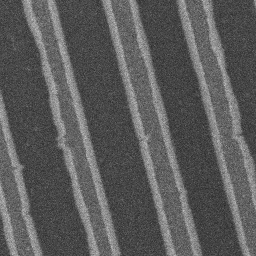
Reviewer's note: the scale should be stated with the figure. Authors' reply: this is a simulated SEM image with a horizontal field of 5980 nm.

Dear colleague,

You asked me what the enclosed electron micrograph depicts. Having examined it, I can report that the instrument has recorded one or a few lines or trenches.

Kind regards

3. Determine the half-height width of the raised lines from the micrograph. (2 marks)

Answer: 599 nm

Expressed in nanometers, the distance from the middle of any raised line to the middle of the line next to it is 1750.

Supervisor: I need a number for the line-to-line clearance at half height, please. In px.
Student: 51.1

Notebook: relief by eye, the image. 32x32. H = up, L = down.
LLLHHHHLLLLLLHHHHLLLLLLHHHLLLLLL
LLLHHHHLLLLLLLHHHLLLLLLHHHLLLLLL
LLLLHHHLLLLLLLHHHLLLLLLHHHLLLLLL
LLLLHHHLLLLLLLHHHHLLLLLHHHHLLLLL
LLLLHHHHLLLLLLHHHHLLLLLLHHHLLLLL
LLLLLHHHLLLLLLLHHHLLLLLLHHHLLLLL
LLLLLHHHLLLLLLLHHHLLLLLLHHHHLLLL
LLLLLHHHLLLLLLLHHHHLLLLLHHHHLLLL
LLLLLLHHHLLLLLLHHHHLLLLLLHHHLLLL
LLLLLLHHHLLLLLLLHHHLLLLLLHHHLLLL
LLLLLLHHHLLLLLLLHHHLLLLLLHHHLLLL
LLLLLLHHHLLLLLLLHHHHLLLLLLHHHLLL
LLLLLLLHHHLLLLLLHHHHLLLLLLHHHLLL
LLLLLLLHHHLLLLLLLHHHLLLLLLHHHLLL
LLLLLLLHHHLLLLLLLHHHLLLLLLHHHLLL
HLLLLLLHHHLLLLLLLHHHHLLLLLHHHHLL
HLLLLLLLHHHLLLLLLHHHHLLLLLLHHHLL
HLLLLLLLHHHLLLLLLLHHHLLLLLLHHHLL
HLLLLLLLHHHLLLLLLLHHHLLLLLLHHHHL
HHLLLLLLHHHLLLLLLLHHHHLLLLLHHHHL
HHLLLLLLLHHHLLLLLLHHHHLLLLLLHHHL
HHLLLLLLLHHHLLLLLLLHHHLLLLLLHHHH
HHHLLLLLLHHHLLLLLLLHHHLLLLLLHHHH
HHHLLLLLLHHHHLLLLLLHHHHLLLLLHHHH
HHHLLLLLLLHHHLLLLLLHHHHLLLLLLHHH
HHHLLLLLLLHHHLLLLLLLHHHLLLLLLHHH
HHHLLLLLLLHHHLLLLLLLHHHLLLLLLHHH
LHHHLLLLLLLHHHLLLLLLHHHHLLLLLLHH
LHHHLLLLLLLHHHLLLLLLHHHHLLLLLLHH
LHHHLLLLLLLHHHLLLLLLLHHHLLLLLLHH
LHHHHLLLLLLHHHLLLLLLLHHHLLLLLLHH
LLHHHLLLLLLLHHHLLLLLLHHHHLLLLLLH